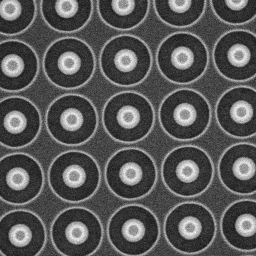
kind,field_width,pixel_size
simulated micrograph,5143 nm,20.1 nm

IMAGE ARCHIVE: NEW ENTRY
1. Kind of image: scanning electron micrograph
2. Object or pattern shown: an array of small figures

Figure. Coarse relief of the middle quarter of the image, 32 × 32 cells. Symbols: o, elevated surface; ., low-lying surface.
ooo.....o.....ooo....ooo.....o..
ooo....ooo...........ooo........
.......ooo...........oooo.......
......ooooo.........oooooo......
.....oooooooo......ooooooooo...o
....oooooooooooooooooooooooooooo
ooooooooooooooooooooooooooooo..o
oooooooooooooo....ooooooooo.....
.....ooooooo........oooooo......
......ooooo..........oooo.......
.......ooo............oo......o.
........oo.....oo.....oo....oooo
oooo....oo....oooo....oo....oooo
oooo....oo....oooo....oo....oooo
oooo....oo....oooo....oo.....oo.
.ooo....oo............ooo.......
........ooo..........oooo.......
.......oooo..........oooooo.....
......oooooo........oooooooo....
.....ooooooooooo.ooooooooooooooo
oooooooooooooooooooooooooooooo..
ooooooooooooooo....ooooooooo....
.....oooooooo.......oooooo......
.......ooooo.........ooooo......
........ooo...........ooo.......
........ooo.....oo.....oo....ooo
.ooo.....oo....oooo....oo....ooo
ooooo....o.....oooo....oo....ooo
ooooo....o.....oooo....oo....ooo
.ooo.....oo.....oo.....oo.......
........ooo...........oooo......
........oooo..........ooooo.....